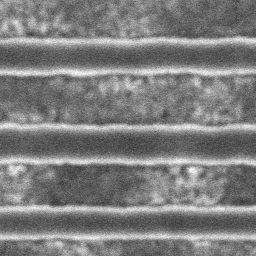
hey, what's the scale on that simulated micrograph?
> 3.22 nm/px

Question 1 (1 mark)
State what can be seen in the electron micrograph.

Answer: lines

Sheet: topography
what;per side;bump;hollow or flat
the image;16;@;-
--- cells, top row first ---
----------------
----------------
@@@@-@@--@@@-@@@
@@@@@@@@@@@@@@@@
@@@@@@@@@@@@@@@@
----------------
----------------
----------------
@@@@@@@@@@@@@@@@
@@@@@@@@@@@@@@@@
----------------
----------------
----------------
@@@@@@@@@@@@@@@@
@@@@@@@@@@@@@@@@
----------------